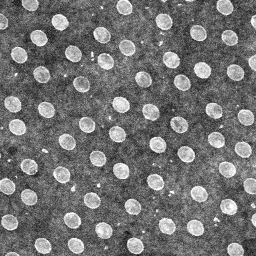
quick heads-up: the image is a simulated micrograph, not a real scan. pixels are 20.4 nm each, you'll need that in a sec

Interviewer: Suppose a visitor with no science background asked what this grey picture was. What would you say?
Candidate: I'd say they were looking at a regular array of raised bodies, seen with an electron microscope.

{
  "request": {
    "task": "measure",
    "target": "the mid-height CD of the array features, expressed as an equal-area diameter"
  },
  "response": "316 nanometers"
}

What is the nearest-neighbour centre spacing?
0.605 microns